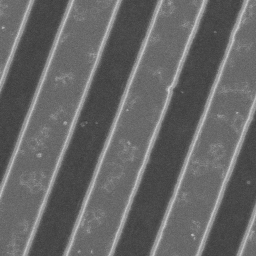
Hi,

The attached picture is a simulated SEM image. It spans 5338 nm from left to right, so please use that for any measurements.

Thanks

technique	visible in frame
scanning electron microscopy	one or a few lines or trenches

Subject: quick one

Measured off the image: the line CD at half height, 926 nanometers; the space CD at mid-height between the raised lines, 0.786 microns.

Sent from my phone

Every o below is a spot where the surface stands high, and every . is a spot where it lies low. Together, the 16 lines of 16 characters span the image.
oo..ooo...ooo..o
o...ooo...oo...o
o...ooo..ooo..oo
o..ooo...ooo..oo
...ooo..ooo...oo
..ooo...ooo..ooo
..ooo...oo...ooo
..ooo..ooo...ooo
.ooo...ooo..ooo.
.ooo..ooo...ooo.
.ooo..ooo...oo..
ooo...ooo..ooo..
ooo..ooo...ooo..
oo...ooo..ooo...
oo...oo...ooo..o
oo..ooo...ooo..o